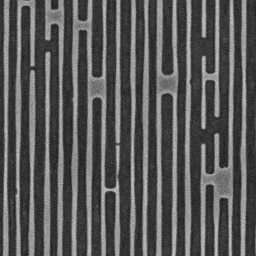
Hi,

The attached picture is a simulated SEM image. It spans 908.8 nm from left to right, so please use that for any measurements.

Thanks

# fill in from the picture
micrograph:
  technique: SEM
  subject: parallel lines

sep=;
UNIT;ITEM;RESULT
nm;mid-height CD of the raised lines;16.4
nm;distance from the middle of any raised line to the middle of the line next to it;49.6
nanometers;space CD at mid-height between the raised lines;32.8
